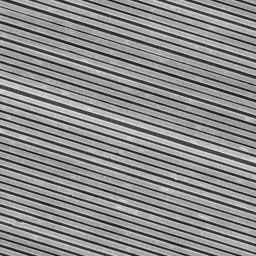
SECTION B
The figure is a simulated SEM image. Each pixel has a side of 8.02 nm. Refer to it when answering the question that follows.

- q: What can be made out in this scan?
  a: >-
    parallel lines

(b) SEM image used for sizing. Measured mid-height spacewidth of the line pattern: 21.1 nm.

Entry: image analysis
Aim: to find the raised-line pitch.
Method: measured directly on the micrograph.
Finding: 61.2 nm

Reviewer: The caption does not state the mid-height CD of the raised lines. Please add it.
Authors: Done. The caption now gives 41.2 nanometers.